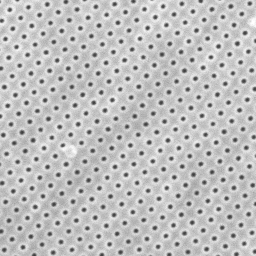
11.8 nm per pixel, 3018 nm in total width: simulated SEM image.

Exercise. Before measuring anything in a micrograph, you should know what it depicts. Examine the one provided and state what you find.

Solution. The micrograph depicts a regular array of holes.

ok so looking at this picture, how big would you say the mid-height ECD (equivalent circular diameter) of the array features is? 58 nm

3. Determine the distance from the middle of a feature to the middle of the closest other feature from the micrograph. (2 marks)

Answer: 154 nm